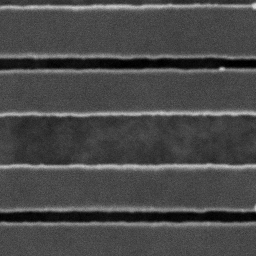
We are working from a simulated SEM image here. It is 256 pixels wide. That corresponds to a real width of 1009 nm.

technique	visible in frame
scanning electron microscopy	lines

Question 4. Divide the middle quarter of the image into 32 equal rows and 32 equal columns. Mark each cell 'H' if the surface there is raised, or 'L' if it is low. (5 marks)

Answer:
LLLLLLLLLLLLLLLLLLLLLLLLLLLLLLLL
HHHLLHHHHHHHHHHHHHHHHHHHHHHHHHLH
HHHHHHHHHHHHHHHHHHHHHHHHHHHHHHHH
HHHHHHHHHHHHHHHHHHHHHHHHHHHHHHHH
HHHHHHHHHHHHHHHHHHHHHHHHHHHHHHHH
HHHHHHHHHHHHHHHHHHHHHHHHHHHHHHHH
HHHHHHHHHHHHHHHHHHHHHHHHHHHHHHHH
HHHHHHHHHHHHHHHHHHHHHHHHHHHHHHHH
HHHHHHHHHHHHHHHHHHHHHHHHHHHHHHHH
HHHHHHHHHHHHHHHHHHHHHHHHHHHHHHHH
HHHHHHHHHHHHHHHHHHHHHHHHHHHHHHHH
HHHHHHHHHHHHHHHHHHHHHHHHHHHHHHHH
HHHHHHHHHHHHHHHHHHHHHHHHHHHHHHHH
LLLLLLLLLLLLLLLLLLLLLLLLLLLLLLLL
LLLLLLLLLLLLLLLLLLLLLLLLLLLLLLLL
LLLLLLLLLLLLLLLLLLLLLLLLLLLLLLLL
LLLLLLLLLLLLLLLLLLLLLLLLLLLLLLLL
LLLLLLLLLLLLLLLLLLLLLLLLLLLLLLLL
LLLLLLLLLLLLLLLLLLLLLLLLLLLLLLLL
LLLLLLLLLLLLLLLLLLLLLLLLLLLLLLLL
LLLLLLLLLLLLLLLLLLLLLLLLLLLLLLLL
LLLLLLLLLLLLLLLLLLLLLLLLLLLLLLLL
LLLLLLLLLLLLLLLLLLLLLLLLLLLLLLLL
LLLLLLLLLLLLLLLLLLLLLLLLLLLLLLLL
LLLLLLLLLLLLLLLLLLLLLLLLLLLLLLLL
HHHHHHHHHHHHHHHHHHHHHHHHHHHHHHHH
HHHHHHHHHHHHHHHHHHHHHHHHHHHHHHHH
HHHHHHHHHHHHHHHHHHHHHHHHHHHHHHHH
HHHHHHHHHHHHHHHHHHHHHHHHHHHHHHHH
HHHHHHHHHHHHHHHHHHHHHHHHHHHHHHHH
HHHHHHHHHHHHHHHHHHHHHHHHHHHHHHHH
HHHHHHHHHHHHHHHHHHHHHHHHHHHHHHHH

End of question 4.